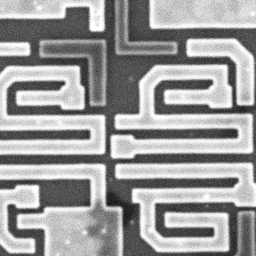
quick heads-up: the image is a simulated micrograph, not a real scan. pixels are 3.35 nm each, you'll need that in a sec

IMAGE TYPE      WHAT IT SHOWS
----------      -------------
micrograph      wiring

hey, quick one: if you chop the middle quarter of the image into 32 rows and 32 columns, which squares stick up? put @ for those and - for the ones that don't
------@@@@----------------------
@@@@--@@@@------------@@@@@@@@@@
@@@@--@@@@-----------@@@@@@@@@@@
@@@@--@@@@----------@@@@@@@@@@@@
-@@@--@@@@---------@@@@@--------
@@@@--@@@@---------@@@@---------
@@@@@-@@@@---------@@@----------
@@@@@-@@@@---------@@@---@@@@@@@
@@@@@-@@@@---------@@@---@@@@@@@
@@@@@--@@@---------@@@---@@@@@@@
@@@@@--------------@@@----------
-------------------@@@----------
-------------------@@@----------
@@@@@@@@@@---@@@@@@@@@@@@@@@@@@@
@@@@@@@@@@---@@@@@@@@@@@@@@@@@@@
@@@@@@@@@@---@@@@@@@@@@@@@@@@@@@
-------@@@----------------------
-------@@@----------------------
-------@@@--@@@@@---------------
@@@@@@@@@@--@@@@@@@@@@@@@@@@@@@@
@@@@@@@@@@--@@@@@@@@@@@@@@@@@@@@
@@@@@@@@@@--@@@@@@@@@@@@@@@@@@@@
------------@@@@@@--------------
--------------------------------
--------------------------------
@@@@@@@@@@---@@@@@@@@@@@@@@@@@@@
@@@@@@@@@@---@@@@@@@@@@@@@@@@@@@
@@@@@@@@@@---@@@@@@@@@@@@@@@@@@@
------@@@@----------------------
-------@@@----------------------
-------@@@----------------------
-------@@@-------@@@@@@@@@@@@@@@